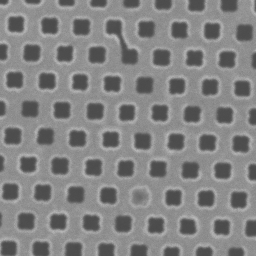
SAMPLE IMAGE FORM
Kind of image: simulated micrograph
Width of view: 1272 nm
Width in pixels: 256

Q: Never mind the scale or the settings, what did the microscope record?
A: a regular array of holes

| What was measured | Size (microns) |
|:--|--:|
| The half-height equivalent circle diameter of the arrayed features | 0.0856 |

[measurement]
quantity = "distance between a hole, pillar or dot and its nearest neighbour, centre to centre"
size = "31.9 pixels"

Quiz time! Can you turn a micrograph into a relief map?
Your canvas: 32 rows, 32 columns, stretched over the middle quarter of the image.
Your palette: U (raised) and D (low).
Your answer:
UUUUUUUUUUUUUUUUUUUUUUUUDUUUUUUD
UUUUUUUUUUUUUUUUUUUUUUUUUUUUUUUU
UUUUUUUUUUUUUUUUUUUUUUUUUUUUUUUU
UUDDDDUUUUDDDDUUUUUDDDUUUUUDDUUU
UUDDDDUUUUDDDDUUUUDDDDUUUUDDDDUU
UUDDDDUUUUDDDDUUUUDDDDUUUUDDDDUU
UUUDDUUUUUDDDDUUUUDDDDUUUUDDDDUU
UUUUUUUUUUUUUUUUUUUUUUUUUUUDUDUU
UUUUUUUUUUUUUUUUUUUUUUUUUUUUUUUU
UUUUUUUUUUUUUUUUUUUUUUUUUUUUUUUU
DDUUUUDDDDUUUUDDDUUUUUUDDDUUUUUU
DUUUUUDDDDUUUUDDDDUUUUDDDDUUUUDD
DUUUUUDDDDUUUUDDDDUUUUDDDDUUUUDD
DUUUUUDDDDUUUUDDDDUUUUDDDDUUUUDD
UUUUUUUUUUUUUUUUUUUUUUUUUUUUUUUD
UUUUUUUUUUUUUUUUUUUUUUUUUUUUUUUU
UUUUUUUUUUUUUUUUUUUUUUUUUUUUUUUU
UDDDDUUUUUDDDDUUUUDDDUUUUUUDDUUU
UDDDDUUUUUDDDDUUUUDDDDUUUUDDDDUU
UDDDDUUUUUDDDDUUUUDDDDUUUUDDDDUU
UUDDDUUUUUDDDUUUUUDDDDUUUUDDDDUU
UUUUUUUUUUUUUUUUUUUUUUUUUUUUUUUU
UUUUUUUUUUUUUUUUUUUUUUUUUUUUUUUU
UUUUUUUUUUUUUUUUUUUUUUUUUUUUUUUU
DUUUUDDDDUUUUUDDDUUUUUDDDUUUUUUU
DUUUUDDDDUUUUDDDDUUUUUDDDDUUUUDD
DUUUUDDDDUUUUDDDDUUUUUDDDUUUUUDD
UUUUUUDDDUUUUUDDDUUUUDDDDUUUUDDD
UUUUUUUUUUUUUUUUUUUUUUUUUUUUUUDD
UUUUUUUUUUUUUUUUUUUUUUUUUUUUUUUU
UUUUUUUUUUUUUUUUUUUUUUUUUUUUUUUU
UDDDDUUUUDDDDUUUUUUUUUUUUUDDDUUU